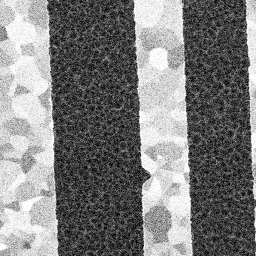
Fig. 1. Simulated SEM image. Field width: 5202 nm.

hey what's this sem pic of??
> one or a few lines or trenches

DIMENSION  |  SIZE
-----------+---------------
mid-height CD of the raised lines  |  952 nanometers